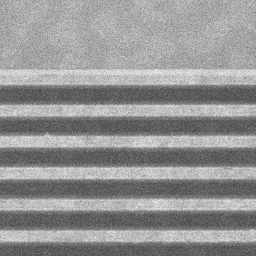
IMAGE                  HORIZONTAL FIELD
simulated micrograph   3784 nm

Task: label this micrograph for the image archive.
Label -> parallel lines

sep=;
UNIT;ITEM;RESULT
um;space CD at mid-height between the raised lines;0.259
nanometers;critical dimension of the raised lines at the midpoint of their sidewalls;201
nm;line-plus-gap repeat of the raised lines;465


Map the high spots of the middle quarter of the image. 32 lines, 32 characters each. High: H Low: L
LLLLLLLLLLLLLLLLLLLLLLLLLLLLLLLL
LLLLLLLLLLLLLLLLLLLLLLLLLLLLLLLL
HHHHHHHHHHHHHHHHHHHHHHHHHHHHHHHH
HHHHHHHHHHHHHHHHHHHHHHHHHHHHHHHH
HHHHHHHHHHHHHHHHHHHHHHHHHHHHHHHH
LLLLLLLLLLLLLLLLLLLLLLLLLLLLLLLL
LLLLLLLLLLLLLLLLLLLLLLLLLLLLLLLL
LLLLLLLLLLLLLLLLLLLLLLLLLLLLLLLL
LLLLLLLLLLLLLLLLLLLLLLLLLLLLLLLL
LLLLLLLLLLLLLLLLLLLLLLLLLLLLLLLL
HHHHHHHHHHHHHHHHHHHHHHHHHHHHHHHH
HHHHHHHHHHHHHHHHHHHHHHHHHHHHHHHH
HHHHHHHHHHHHHHHHHHHHHHHHHHHHHHHH
LLLLLLLLLLLLLLLLLLLLLLLLLLLLLLLL
LLLLLLLLLLLLLLLLLLLLLLLLLLLLLLLL
LLLLLLLLLLLLLLLLLLLLLLLLLLLLLLLL
LLLLLLLLLLLLLLLLLLLLLLLLLLLLLLLL
LLLLLLLLLLLLLLLLLLLLLLLLLLLLLLLL
HHHHHHHHHHHHHHHHHHHHHHHHHHHHHHHH
HHHHHHHHHHHHHHHHHHHHHHHHHHHHHHHH
HHHHHHHHHHHHHHHHHHHHHHHHHHHHHHHH
LLLLLLLLLLLLLLLLLLLLLLLLLLLLLLLL
LLLLLLLLLLLLLLLLLLLLLLLLLLLLLLLL
LLLLLLLLLLLLLLLLLLLLLLLLLLLLLLLL
LLLLLLLLLLLLLLLLLLLLLLLLLLLLLLLL
LLLLLLLLLLLLLLLLLLLLLLLLLLLLLLLL
HHHHHHHHHHHHHHHHHHHHHHHHHHHHHHHH
HHHHHHHHHHHHHHHHHHHHHHHHHHHHHHHH
HHHHHHHHHHHHHHHHHHHHHHHHHHHHHHHH
LLLLLLLLLLLLLLLLLLLLLLLLLLLLLLLL
LLLLLLLLLLLLLLLLLLLLLLLLLLLLLLLL
LLLLLLLLLLLLLLLLLLLLLLLLLLLLLLLL